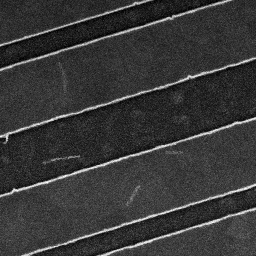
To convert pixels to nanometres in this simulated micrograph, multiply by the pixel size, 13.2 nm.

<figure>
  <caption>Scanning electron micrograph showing one or a few lines or trenches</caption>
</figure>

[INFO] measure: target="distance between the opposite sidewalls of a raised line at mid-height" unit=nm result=844